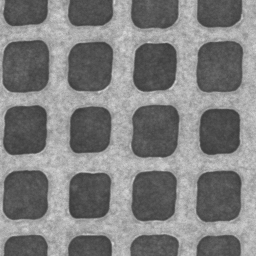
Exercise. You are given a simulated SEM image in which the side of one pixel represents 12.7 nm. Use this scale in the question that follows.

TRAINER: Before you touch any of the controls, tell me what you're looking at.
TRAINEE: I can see a regular array of holes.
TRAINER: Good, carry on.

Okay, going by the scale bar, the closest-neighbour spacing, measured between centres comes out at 815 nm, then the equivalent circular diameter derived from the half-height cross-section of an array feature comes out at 645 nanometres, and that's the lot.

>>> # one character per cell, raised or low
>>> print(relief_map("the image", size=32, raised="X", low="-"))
X-----XXX-----XX------XXX-----XX
------XX------XX------XXX-----XX
X-----XXX-----XX------XXX-----XX
XXXXXXXXXXXXXXXXX--X-XXXXXXXXXXX
XXXXXXXXXXXXXXXXXXXXXXXXXXXXXXXX
X-----XXXX---XXXXX---XXXXX----XX
------XXX-----XXX-----XXX-----XX
------XXX-----XXX-----XXX-----XX
------XXX-----XXX-----XXX-----XX
------XX------XXX-----XXX-----XX
------XXX-----XXX-----XXX-----XX
XX--XXXXXXX-XXXXXX-XXXXXXXXXXXXX
XXXXXXXXXXXXXXXXXXXXXXXXXXXXXXXX
X----XXXXX---XXXX-----XXXXXXXXXX
X-----XXX-----XXX-----XXX-----XX
X-----XXX-----XXX-----XXX-----XX
------XXX-----XXX-----XXX-----XX
------XXX-----XX------XXX-----XX
X-----XXX----XXX------XXX-----XX
XXXXXXXXXXXXXXXXX----XXXXXXXXXXX
XXXXXXXXXXXXXXXXXXXXXXXXXXXXXXXX
XX---XXXXXXXXXXXXX---XXXXX---XXX
X-----XXX-----XXX-----XXX-----XX
------XXX-----XXX-----XXX-----XX
------XXX-----XX------XXX-----XX
------XXX-----XX------XXX-----XX
------XXX----XXXX-----XXX-----XX
XXXXXXXXXXXXXXXXX----XXXX----XXX
XXXXXXXXXXXXXXXXXXXXXXXXXXXXXXXX
XXX--XXXXX---XXXX----XXXXX---XXX
X-----XXX-----XX------XXX-----XX
------XXX-----XX------XXX-----XX